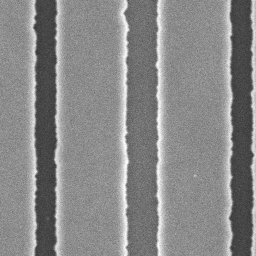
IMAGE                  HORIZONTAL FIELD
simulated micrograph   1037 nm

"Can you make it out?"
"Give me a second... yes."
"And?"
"lines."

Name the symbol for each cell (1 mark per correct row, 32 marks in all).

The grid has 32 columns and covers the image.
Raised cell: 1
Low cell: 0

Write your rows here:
11110001111111110000111111111000
11110001111111110000111111111001
11110001111111110000111111111001
11110001111111110000111111111000
11110001111111110000111111111000
11110001111111110000111111111000
11110001111111110000111111111000
11110001111111110000111111111000
11110001111111110000111111111000
11110001111111110000111111111000
11110001111111110000111111111000
11110001111111110000111111111000
11110001111111110000111111111000
11110001111111110000111111111000
11110001111111110000111111111000
11110001111111110000111111111000
11110001111111110000111111111000
11110001111111110000111111111000
11110001111111110000111111111001
11110001111111110000111111111000
11110001111111110000111111111000
11110001111111110000111111111000
11110001111111110000111111111000
11110001111111110000111111111000
11110001111111110000111111111000
11110001111111110000111111111000
11110001111111110000111111111000
11110001111111110000111111111000
11110001111111110000111111111000
11110001111111110000111111111000
11110001111111110000111111111000
11110001111111110000111111111001